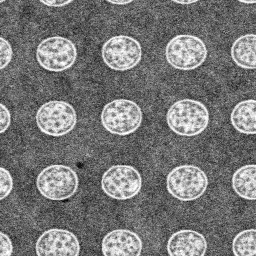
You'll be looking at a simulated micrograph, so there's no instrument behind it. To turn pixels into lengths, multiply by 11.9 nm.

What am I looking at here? a regular array of raised bodies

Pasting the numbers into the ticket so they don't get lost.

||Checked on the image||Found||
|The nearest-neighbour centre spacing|765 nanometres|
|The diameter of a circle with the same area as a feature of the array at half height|436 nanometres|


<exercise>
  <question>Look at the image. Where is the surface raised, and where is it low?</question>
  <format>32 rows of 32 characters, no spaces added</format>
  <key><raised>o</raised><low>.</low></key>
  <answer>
......oo........................
................................
................................
................................
......................oo.......o
o....oooo....oooo....oooo....ooo
o....oooo....ooooo...ooooo...ooo
o....oooo....oooo....oooo....ooo
......oo......oo......oo........
................................
................................
................................
...............o................
o....oooo....oooo....ooooo...ooo
o....oooo....ooooo...ooooo...ooo
o....oooo....oooo....ooooo...ooo
......oo......oo......ooo.....oo
................................
................................
................................
................................
o....oooo....oooo.....ooo.....oo
o....ooooo...ooooo...ooooo...ooo
o....oooo....oooo....ooooo...ooo
o.....ooo.....oo......ooo.....oo
................................
................................
................................
................................
o....oooo....oooo.....ooo.....oo
o....ooooo...ooooo...ooooo...ooo
o....ooooo...oooo....ooooo...ooo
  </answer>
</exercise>